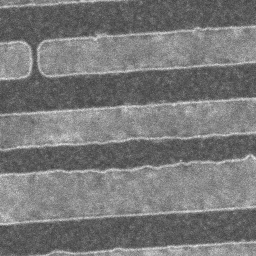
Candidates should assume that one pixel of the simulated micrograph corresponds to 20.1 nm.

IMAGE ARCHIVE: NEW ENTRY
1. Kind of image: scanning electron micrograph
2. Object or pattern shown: one or a few lines or trenches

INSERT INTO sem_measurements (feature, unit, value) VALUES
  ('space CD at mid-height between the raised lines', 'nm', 704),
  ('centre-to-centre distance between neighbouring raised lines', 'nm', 1420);